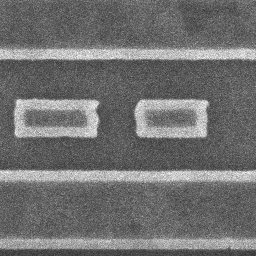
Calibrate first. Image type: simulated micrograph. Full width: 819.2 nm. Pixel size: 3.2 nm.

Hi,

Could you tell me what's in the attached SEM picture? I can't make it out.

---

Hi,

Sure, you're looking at one or a few lines or trenches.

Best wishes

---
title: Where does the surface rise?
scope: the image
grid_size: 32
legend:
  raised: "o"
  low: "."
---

oooooooooooooooooooooooooooooooo
oooooooooooooooooooooooooooooooo
oooooooooooooooooooooooooooooooo
oooooooooooooooooooooooooooooooo
oooooooooooooooooooooooooooooooo
oooooooooooooooooooooooooooooooo
oooooooooooooooooooooooooooooooo
................................
................................
................................
................................
................................
................................
..ooooooooo.......ooooooo.......
..oooooooooo.....oooooooo.......
..oooooooooo......ooooooo.......
...o.oooooo.......ooooooo.......
................................
................................
................................
................................
................................
oooooooooooooooooooooooooooooooo
oooooooooooooooooooooooooooooooo
oooooooooooooooooooooooooooooooo
oooooooooooooooooooooooooooooooo
oooooooooooooooooooooooooooooooo
oooooooooooooooooooooooooooooooo
oooooooooooooooooooooooooooooooo
oooooooooooooooooooooooooooooooo
oooooooooooooooooooooooooooooooo
................................